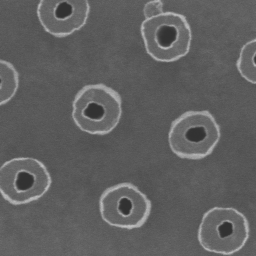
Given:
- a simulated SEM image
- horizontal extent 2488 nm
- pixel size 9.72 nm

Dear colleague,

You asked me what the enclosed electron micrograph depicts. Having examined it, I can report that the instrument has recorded ring-shaped raised bodies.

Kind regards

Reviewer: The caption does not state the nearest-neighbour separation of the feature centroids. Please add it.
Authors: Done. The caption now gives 965 nanometres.